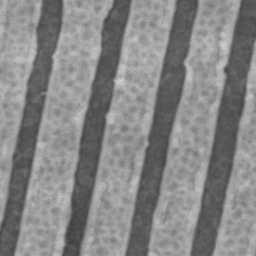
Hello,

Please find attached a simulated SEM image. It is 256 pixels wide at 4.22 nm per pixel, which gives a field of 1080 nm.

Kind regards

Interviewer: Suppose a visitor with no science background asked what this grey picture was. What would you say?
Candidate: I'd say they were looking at one or a few lines or trenches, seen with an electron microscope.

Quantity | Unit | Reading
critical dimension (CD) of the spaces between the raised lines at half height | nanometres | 106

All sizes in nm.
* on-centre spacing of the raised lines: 272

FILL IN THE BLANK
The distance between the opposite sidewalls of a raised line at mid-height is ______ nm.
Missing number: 168